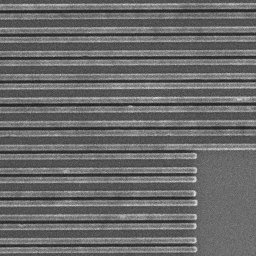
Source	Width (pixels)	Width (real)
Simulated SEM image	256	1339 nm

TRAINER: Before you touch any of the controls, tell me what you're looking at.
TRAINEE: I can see parallel lines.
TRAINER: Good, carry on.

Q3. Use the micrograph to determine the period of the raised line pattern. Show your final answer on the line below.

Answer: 60.7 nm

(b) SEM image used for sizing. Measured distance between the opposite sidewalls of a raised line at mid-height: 27.5 nm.